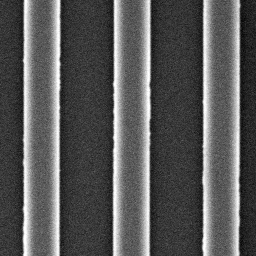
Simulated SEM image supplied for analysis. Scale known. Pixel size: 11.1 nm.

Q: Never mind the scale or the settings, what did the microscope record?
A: lines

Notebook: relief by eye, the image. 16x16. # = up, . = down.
..##...##....##.
..##...##....##.
..##...##....##.
..##...##....##.
..##...##....##.
..##...##....##.
..##...##....##.
..##...##....##.
..##...##....##.
..##...##....##.
..##...##....##.
..##...##....##.
..##...##....##.
..##...##....##.
..##...##....##.
..##...##....##.